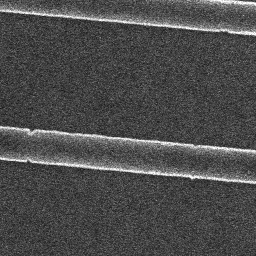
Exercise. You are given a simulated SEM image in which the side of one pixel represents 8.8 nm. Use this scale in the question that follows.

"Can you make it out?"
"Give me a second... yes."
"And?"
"one or a few lines or trenches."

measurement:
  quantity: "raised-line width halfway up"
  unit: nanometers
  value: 279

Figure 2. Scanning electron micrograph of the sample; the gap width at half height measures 1020 nm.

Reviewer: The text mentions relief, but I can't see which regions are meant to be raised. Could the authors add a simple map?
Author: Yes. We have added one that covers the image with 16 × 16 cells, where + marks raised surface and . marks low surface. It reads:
++++++++++++++++
.........+++++++
................
................
................
................
................
................
++++++..........
++++++++++++++++
......++++++++++
................
................
................
................
................